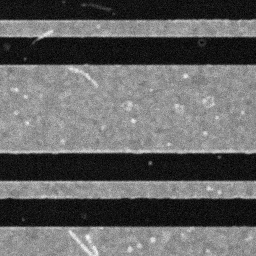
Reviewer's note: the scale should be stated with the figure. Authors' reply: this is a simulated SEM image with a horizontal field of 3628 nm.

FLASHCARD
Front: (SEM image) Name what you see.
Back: lines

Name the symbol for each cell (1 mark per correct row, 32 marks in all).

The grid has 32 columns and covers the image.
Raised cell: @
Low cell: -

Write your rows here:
--------------------------------
--------------------------------
----------------------@@@@@@--@@
@@@@@@@@@@@@@@@@@@@@@@@@@@@@@@@@
@@@@@@@@@@@@@@@@@@@@@@@@@@@@@@@@
--------------------------------
--------------------------------
--------------------------------
@@@@@@@@@@@@@@@@@@@@@@@@@@@@@@@@
@@@@@@@@@@@@@@@@@@@@@@@@@@@@@@@@
@@@@@@@@@@@@@@@@@@@@@@@@@@@@@@@@
@@@@@@@@@@@@@@@@@@@@@@@@@@@@@@@@
@@@@@@@@@@@@@@@@@@@@@@@@@@@@@@@@
@@@@@@@@@@@@@@@@@@@@@@@@@@@@@@@@
@@@@@@@@@@@@@@@@@@@@@@@@@@@@@@@@
@@@@@@@@@@@@@@@@@@@@@@@@@@@@@@@@
@@@@@@@@@@@@@@@@@@@@@@@@@@@@@@@@
@@@@@@@@@@@@@@@@@@@@@@@@@@@@@@@@
@@@@@@@@@@@@@@@@@@@@@@@@@@@@@@@@
--------------------------------
--------------------------------
--------------------------------
--------------------------------
@@@@@@@@@@@@@@@@@@@@@@@@@@@@@@@@
@@@@@@@@@@@@@@@@@@@@@@@@@@@@@@@@
--------------------------------
--------------------------------
--------------------------------
@@@@@@@@@@@@@@@@@@@@@@@@@@@@@@@@
@@@@@@@@@@@@@@@@@@@@@@@@@@@@@@@@
@@@@@@@@@@@@@@@@@@@@@@@@@@@@@@@@
@@@@@@@@@@@@@@@@@@@@@@@@@@@@@@@@